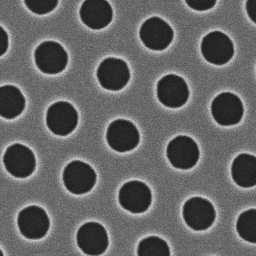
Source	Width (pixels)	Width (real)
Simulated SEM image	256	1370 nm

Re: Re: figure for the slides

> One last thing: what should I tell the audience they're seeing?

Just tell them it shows a regular array of holes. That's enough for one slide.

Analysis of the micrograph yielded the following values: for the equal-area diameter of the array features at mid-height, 178 nanometers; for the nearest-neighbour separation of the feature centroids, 321 nanometres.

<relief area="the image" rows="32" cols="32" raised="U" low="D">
UUUDDDDUUUDDDDUUUUUUUUUDDDDUUUUD
UUUUDDUUUUDDDDUUUUUUUUUUUUUUUUUD
UUUUUUUUUUDDDDUUUUDDUUUUUUUUUUUD
UUUUUUUUUUUDDUUUUUDDDUUUUUUUUUUU
DUUUUUUUUUUUUUUUUDDDDDUUUUDDUUUU
DUUUUDDUUUUUUUUUUUDDDUUUUDDDDUUU
DUUUDDDDUUUUUUUUUUUUUUUUUDDDDUUU
UUUUDDDDUUUUUDDUUUUUUUUUUUDDDUUU
UUUUUDDDUUUUDDDDUUUUUUUUUUUUUUUU
UUUUUUUUUUUUDDDDUUUUUDUUUUUUUUUU
UUUUUUUUUUUUUDDDUUUUDDDUUUUUUUUU
DDDUUUUUUUUUUUUUUUUUDDDDUUUUUUUU
DDDUUUUUUUUUUUUUUUUUDDDUUUUDDDUU
DDDUUUDDDUUUUUUUUUUUUUUUUUDDDDUU
DDUUUUDDDDUUUUUUUUUUUUUUUUUDDDUU
UUUUUUDDDDUUUUDDDUUUUUUUUUUDDUUU
UUUUUUUDDUUUUDDDDUUUUUUUUUUUUUUU
UUUUUUUUUUUUUDDDDUUUUUDDUUUUUUUU
UDDDUUUUUUUUUUDDDUUUUDDDDUUUUUUU
DDDDUUUUUUUUUUUUUUUUUDDDDUUUUUDD
UDDDUUUUUDDUUUUUUUUUUDDDUUUUUDDD
UDDDUUUUDDDDUUUUUUUUUUUUUUUUUDDD
UUUUUUUUDDDDUUUUUUUUUUUUUUUUUDDD
UUUUUUUUDDDDUUUDDDDUUUUUUUUUUUUU
UUUUUUUUUUUUUUUDDDDUUUUUUUUUUUUU
UUUUUUUUUUUUUUUDDDDUUUUDDDUUUUUU
UUUDDDUUUUUUUUUUDDUUUUUDDDDUUUUD
UUDDDDUUUUUUUUUUUUUUUUUDDDDUUUDD
UUDDDDUUUUDDDUUUUUUUUUUUDDUUUUDD
UUUDDUUUUUDDDUUUUUUUUUUUUUUUUUDD
UUUUUUUUUUDDDDUUUDDDDUUUUUUUUUUU
UUUUUUUUUUDDDUUUUDDDDUUUUUUUUUUU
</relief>